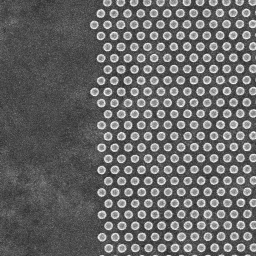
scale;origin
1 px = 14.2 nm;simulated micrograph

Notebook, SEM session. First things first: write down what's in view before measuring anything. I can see a regular array of raised bodies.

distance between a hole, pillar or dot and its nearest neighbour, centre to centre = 183 nanometres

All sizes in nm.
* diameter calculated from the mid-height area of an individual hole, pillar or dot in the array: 114